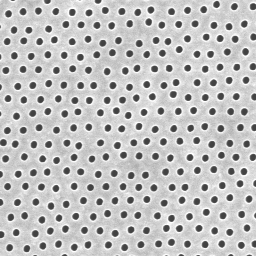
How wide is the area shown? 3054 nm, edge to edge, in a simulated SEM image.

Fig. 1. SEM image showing a regular array of holes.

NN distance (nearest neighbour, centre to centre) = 171 nanometers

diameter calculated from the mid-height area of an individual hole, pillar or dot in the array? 6.87 pixels